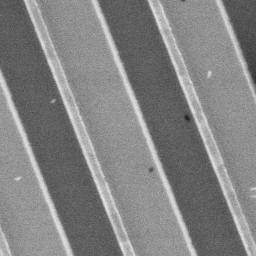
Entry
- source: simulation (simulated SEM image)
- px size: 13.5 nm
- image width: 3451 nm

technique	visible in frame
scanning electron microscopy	lines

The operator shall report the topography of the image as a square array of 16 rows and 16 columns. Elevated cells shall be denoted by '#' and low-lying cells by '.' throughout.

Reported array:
..####...#####..
..####....####..
..#####...#####.
...####....####.
...#####...####.
....####...#####
#...####....####
#...#####...####
#....####....###
##...#####...###
##....####...###
###...####....##
###...#####...##
###....####....#
####...#####...#
####....####...#